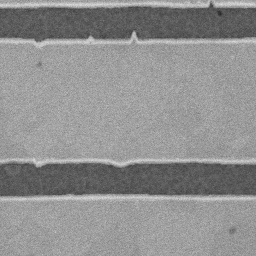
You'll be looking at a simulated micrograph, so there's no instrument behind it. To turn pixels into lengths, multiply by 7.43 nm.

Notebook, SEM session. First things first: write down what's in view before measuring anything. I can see one or a few lines or trenches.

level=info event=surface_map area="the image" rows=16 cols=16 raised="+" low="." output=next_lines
................
................
........+.......
++++++++++++++++
++++++++++++++++
++++++++++++++++
++++++++++++++++
++++++++++++++++
++++++++++++++++
++++++++++++++++
................
................
++++++++++++++++
++++++++++++++++
++++++++++++++++
++++++++++++++++